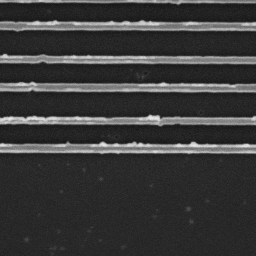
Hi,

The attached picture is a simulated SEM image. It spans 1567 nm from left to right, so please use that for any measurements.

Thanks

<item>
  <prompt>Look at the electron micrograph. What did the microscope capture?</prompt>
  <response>parallel lines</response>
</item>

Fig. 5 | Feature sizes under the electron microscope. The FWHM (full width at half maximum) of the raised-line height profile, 42.1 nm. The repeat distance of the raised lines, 0.187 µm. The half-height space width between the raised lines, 131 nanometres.